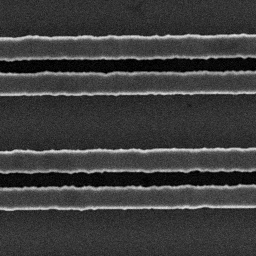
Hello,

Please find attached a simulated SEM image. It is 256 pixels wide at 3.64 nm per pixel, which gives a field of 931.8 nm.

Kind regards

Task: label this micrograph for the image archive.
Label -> lines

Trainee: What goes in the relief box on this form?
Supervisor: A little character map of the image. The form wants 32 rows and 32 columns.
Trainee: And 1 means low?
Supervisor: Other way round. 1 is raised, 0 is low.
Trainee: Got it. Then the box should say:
00000000000000000000000000000000
00000000000000000000000000000000
00000000000000000000000000000000
00000000000000000000000000000000
00000000000000000000010110011111
11111111111111111111111111111111
11111111111111111111111111111111
11110000000000000000000000000000
00000000000000000000000000000000
11111111111111111111111111111111
11111111111111111111111111111111
11111111111111111111111111111111
00000000000000000000000000000000
00000000000000000000000000000000
00000000000000000000000000000000
00000000000000000000000000000000
00000000000000000000000000000000
00000000000000000000000000000000
00000000000000000000000000000000
11111111111111111111111111111111
11111111111111111111111111111111
11111111111110000010000100000000
00000000000000000000000000000000
11111111111111111111111111111111
11111111111111111111111111111111
11111111111111111111111111111111
00000000000000000000000000000000
00000000000000000000000000000000
00000000000000000000000000000000
00000000000000000000000000000000
00000000000000000000000000000000
00000000000000000000000000000000